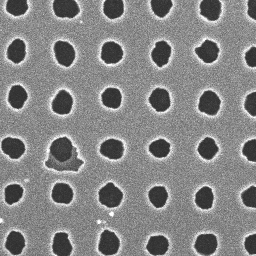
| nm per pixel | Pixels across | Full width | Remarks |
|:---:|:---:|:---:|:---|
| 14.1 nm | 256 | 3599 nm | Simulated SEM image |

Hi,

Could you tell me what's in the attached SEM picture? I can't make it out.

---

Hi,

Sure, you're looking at a regular array of holes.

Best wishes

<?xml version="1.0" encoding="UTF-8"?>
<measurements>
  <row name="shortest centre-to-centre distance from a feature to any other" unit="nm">645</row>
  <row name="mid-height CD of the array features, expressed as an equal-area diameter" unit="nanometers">313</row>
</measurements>